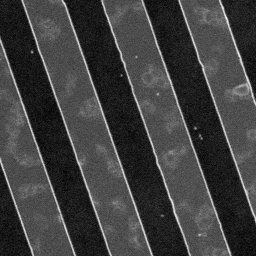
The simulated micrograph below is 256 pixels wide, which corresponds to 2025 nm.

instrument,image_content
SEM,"one or a few lines or trenches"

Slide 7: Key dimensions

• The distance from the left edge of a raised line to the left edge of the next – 584 nm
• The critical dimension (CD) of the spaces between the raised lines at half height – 304 nm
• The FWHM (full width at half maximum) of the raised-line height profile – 280 nanometres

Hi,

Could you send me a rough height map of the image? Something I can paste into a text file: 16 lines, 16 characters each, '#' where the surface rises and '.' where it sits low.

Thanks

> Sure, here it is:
##..###..##...##
##..###..###..##
##...##...##...#
###..###..##...#
.##...##..###..#
.##...##...##..#
.###..###..##...
..##...##..###..
..##...##...##..
..###..###..##..
...##...##..###.
#..##...##...##.
#..###..###..###
#...##...##...##
##..##...##...##
##...##..###..##